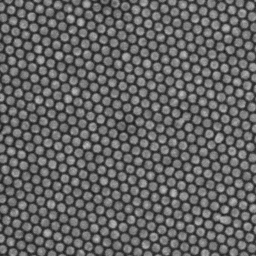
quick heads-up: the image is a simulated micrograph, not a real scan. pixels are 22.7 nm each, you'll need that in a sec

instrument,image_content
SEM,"a regular array of raised bodies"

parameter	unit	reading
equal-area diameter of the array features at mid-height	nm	174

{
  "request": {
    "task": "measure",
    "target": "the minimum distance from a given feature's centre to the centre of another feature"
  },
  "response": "242 nm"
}